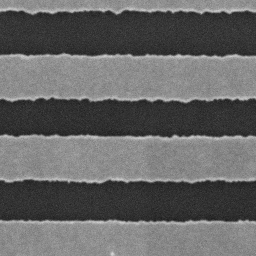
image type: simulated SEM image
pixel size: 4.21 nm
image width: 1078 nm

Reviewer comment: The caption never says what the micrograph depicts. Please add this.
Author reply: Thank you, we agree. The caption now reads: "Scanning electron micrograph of lines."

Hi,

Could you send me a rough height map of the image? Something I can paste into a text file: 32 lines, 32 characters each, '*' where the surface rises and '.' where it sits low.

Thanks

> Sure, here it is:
********************************
...****..*....*.........***.*..*
................................
................................
................................
................................
................................
********************************
********************************
********************************
********************************
********************************
.*.........**..**.*.****.**...*.
................................
................................
................................
................................
********************************
********************************
********************************
********************************
********************************
***...*******.*************.****
................................
................................
................................
................................
................................
********************************
********************************
********************************
********************************